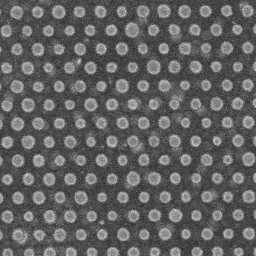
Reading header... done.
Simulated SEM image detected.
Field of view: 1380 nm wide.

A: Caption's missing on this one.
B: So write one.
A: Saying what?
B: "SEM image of a regular array of raised bodies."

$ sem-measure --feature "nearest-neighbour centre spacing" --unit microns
0.111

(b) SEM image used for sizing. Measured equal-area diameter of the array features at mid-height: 0.0557 microns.